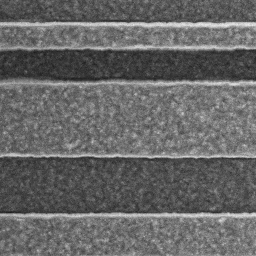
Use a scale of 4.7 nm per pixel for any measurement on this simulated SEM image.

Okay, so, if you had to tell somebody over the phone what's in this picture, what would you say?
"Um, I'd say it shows lines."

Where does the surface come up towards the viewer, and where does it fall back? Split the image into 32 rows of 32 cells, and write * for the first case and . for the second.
................................
................................
................................
********************************
********************************
********************************
................................
................................
................................
................................
********************************
********************************
********************************
********************************
********************************
********************************
********************************
********************************
********************************
********************************
................................
................................
................................
................................
................................
................................
................................
********************************
********************************
********************************
********************************
********************************